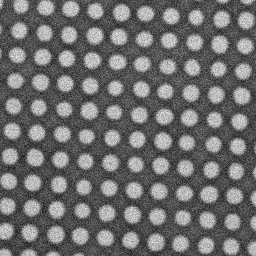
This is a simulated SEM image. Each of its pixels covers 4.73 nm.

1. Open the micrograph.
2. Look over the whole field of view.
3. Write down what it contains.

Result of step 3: an array of small figures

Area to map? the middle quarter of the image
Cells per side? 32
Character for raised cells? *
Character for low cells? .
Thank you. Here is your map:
*.....**....***...***...****..**
...................**...****..**
...............................*
**..............................
**...***....**..................
**...***...****...***...**.....*
**...***...****...***...***...**
............**....***...***...**
.........................*....**
................................
**...***........................
**..****...***...***....**......
**..****...***...****..****...**
.....***....**...****..****..***
..................**....***...**
................................
*....*..........................
**..***....***...***....**......
*...***...****...***...****..***
.....**...****...***...****..***
.................**....***...***
................................
................................
*...***...***....**.............
*...***...****..****...***...**.
....***...***...****..****...***
...........**....**....***...***
.............................***
................................
....**....**....................
*..****..****...***...***.......
...****..****...***...****..****